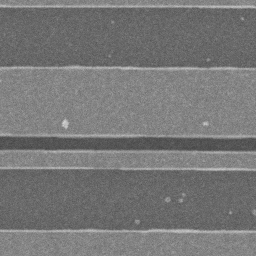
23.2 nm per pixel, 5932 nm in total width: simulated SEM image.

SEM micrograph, lines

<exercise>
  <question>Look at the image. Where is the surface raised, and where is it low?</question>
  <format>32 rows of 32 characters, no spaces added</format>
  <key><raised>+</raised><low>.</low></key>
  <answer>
++++++++++++++++++++++++++++++++
................................
................................
................................
................................
................................
................................
................................
.+..............................
++++++++++++++++++++++++++++++++
++++++++++++++++++++++++++++++++
++++++++++++++++++++++++++++++++
++++++++++++++++++++++++++++++++
++++++++++++++++++++++++++++++++
++++++++++++++++++++++++++++++++
++++++++++++++++++++++++++++++++
++++++++++++++++++++++++++++++++
................................
................................
++++++++++++++++++++++++++++++++
++++++++++++++++++++++++++++++++
................................
................................
................................
................................
................................
................................
................................
................................
++++++++++++++++++++++++++++++++
++++++++++++++++++++++++++++++++
++++++++++++++++++++++++++++++++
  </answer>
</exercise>